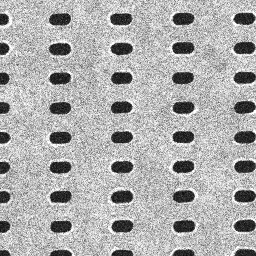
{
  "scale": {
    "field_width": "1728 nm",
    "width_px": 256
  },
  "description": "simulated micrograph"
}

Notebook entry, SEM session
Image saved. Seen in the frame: a regular array of holes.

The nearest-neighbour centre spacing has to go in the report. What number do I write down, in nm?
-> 199